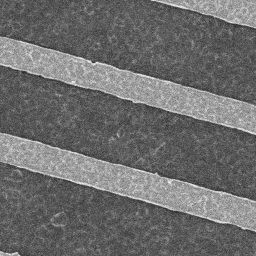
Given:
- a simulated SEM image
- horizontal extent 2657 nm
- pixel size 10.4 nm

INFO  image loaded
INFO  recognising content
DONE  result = one or a few lines or trenches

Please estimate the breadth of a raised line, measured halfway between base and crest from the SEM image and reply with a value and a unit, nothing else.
0.284 micrometres